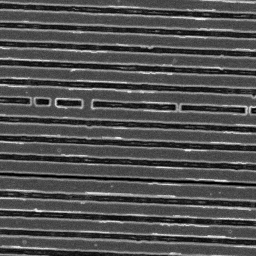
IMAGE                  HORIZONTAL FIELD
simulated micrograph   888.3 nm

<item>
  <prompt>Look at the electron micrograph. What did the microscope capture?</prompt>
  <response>parallel lines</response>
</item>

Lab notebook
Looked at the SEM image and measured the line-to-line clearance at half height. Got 22.5 nm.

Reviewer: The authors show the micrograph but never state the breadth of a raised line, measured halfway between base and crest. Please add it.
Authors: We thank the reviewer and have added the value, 42 nanometres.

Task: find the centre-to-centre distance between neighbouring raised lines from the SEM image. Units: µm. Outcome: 0.0652